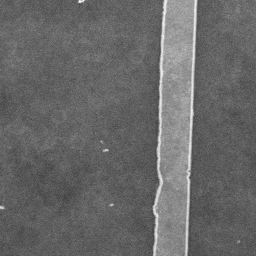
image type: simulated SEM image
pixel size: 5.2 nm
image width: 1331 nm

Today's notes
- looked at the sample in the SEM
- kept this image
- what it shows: one or a few lines or trenches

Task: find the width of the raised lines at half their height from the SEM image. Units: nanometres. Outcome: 162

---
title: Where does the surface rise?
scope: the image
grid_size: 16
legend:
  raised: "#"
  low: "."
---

..........##....
..........##....
..........##....
..........##....
..........##....
..........##....
..........##....
..........##....
..........##....
..........##....
..........##....
..........##....
..........##....
..........##....
..........##....
..........##....